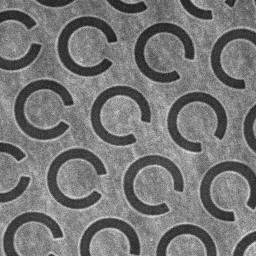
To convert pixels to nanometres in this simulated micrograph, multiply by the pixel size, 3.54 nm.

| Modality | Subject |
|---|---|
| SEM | an array of small figures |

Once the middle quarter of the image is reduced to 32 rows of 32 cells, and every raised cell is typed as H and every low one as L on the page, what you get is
LLLLLHHLLLLLHHHHHHLLLHHHHHHHHHHH
HLLLLLLLLLLHHHHHHHHLLLLHHHHHHHHH
HHLLLLLLLHHHHHHHHHHHLLLLLLLLLHHH
HHHHHHHHHHHHHHHHHHHHHLLLLLLLLHHH
HHHHHHHHHHHHHHHHHHHHHHHLLLLHHHHH
HHHHHHHHHHHHLLLLHHHHHHHHHHHHHHHH
LHHHHHHHHHLLLLLLLLHHHHHHHHHHHHHH
LLHHHHHHHLLLLLLLLLLLHHHHHHHHHHLL
LLHHHHHHLLLLHHHHLLLLHHHHHHHHHLLL
LLHHHHHLLLLHHHHHHHLLLHHHHHHHLLLL
LHHHHHHLLLHHHHHHHHHLLHHHHHHLLLHH
HHHHHHHLLHHHHHHHHHHLLLHHHHLLLHHH
HHHHHHHLLHHHHHHHHHHLLLHHHHLLLHHH
HHHHHHLLLHHHHHHHHHHLLLHHHHLLHHHH
HHHHHHHLLLHHHHHHHHHHLLHHHHLLHHHH
LHHHHHHLLLHHHHHHHHHHHHHHHHLLHHHH
LHHHHHHLLLLHHHHHHHHHHHHHHHLLLHHH
HHHHHHHHLLLLHHHHLHHHHHHHHHLLLHHH
HHHHHHHHHLLLLLLLLLHHHHHHHHHLLLHH
HHHHHHHHHHLLLLLLLLHHHHHHHHHLLLLL
HHHHHHHHHHHHHLLLHHHHHHHHHHHHHLLL
LLLLLLHHHHHHHHHHHHHHHHHHHHHHHHLL
LLLLLLLLHHHHHHHHHHHHHHHHHHHHHHHH
LLLLLLLLLHHHHHHHHHHLLLLLLLHHHHHH
LHHHHHLLLLHHHHHHHLLLLLLLLLLHHHHH
HHHHHHHLLLHHHHHHLLLLLLLLLLLLHHHH
HHHHHHHHLLLHHHHLLLLHHHHHHHLLLHHH
HHHHHHHHLLLHHHHLLLLHHHHHHHLLLLHH
HHHHHHHHHHHHHHHLLLHHHHHHHHHLLLHH
HHHHHHHHHHHHHHHLLLHHHHHHHHHLLLHH
HHHHHHHHHHHHHHHLLLHHHHHHHHHLLLHH
HHHHHHHHHHHHHHHLLLHHHHHHHHHLLLHH